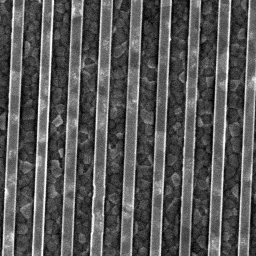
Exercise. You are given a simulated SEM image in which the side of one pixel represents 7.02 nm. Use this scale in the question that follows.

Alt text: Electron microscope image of parallel lines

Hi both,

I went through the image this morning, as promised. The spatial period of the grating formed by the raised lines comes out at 206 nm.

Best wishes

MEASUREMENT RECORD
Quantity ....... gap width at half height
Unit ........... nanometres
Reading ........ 130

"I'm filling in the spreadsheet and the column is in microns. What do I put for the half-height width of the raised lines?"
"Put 0.0745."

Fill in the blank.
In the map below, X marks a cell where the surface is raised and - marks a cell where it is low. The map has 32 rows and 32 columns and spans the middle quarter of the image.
-XXX-----XX-----XXX-----XX-----X
-XXX-----XX-----XXX-----XX-----X
-XXX-----XX-----XXX-----XX-----X
-XXX-----XX-----XXX----XXX-----X
-XXX----XXX-----XXX----XXX-----X
-XXX----XXX-----XXX----XXX-----X
-XXX----XXX-----XXX----XXX-----X
-XXX----XXX-----XX-----XXX-----X
-XXX----XXX-----XX-----XXX-----X
-XXX----XXX-----XX-----XXX-----X
-XXX----XXX-----XX-----XXX-----X
-XXX----XXX-----XX-----XXX-----X
-XXX----XXX-----XX-----XXX-----X
-XX-----XXX-----XX-----XX------X
-XX-----XXX-----XX-----XX------X
-XX-----XXX----XXX-----XX-----XX
-XX-----XXX----XXX-----XX-----XX
-XX-----XXX----XXX-----XX-----XX
-XX-----XXX----XXX-----XX-----XX
-XX-----XX-----XXX-----XX-----XX
-XX-----XX-----XXX-----XX-----XX
XXX-----XX-----XXX-----XX-----XX
XXX-----XX-----XXX-----XX-----XX
XXX-----XX-----XXX-----XX-----XX
XXX-----XX-----XXX-----XX-----XX
XXX-----XX-----XXX-----XX-----XX
XXX-----XX-----XXX-----XX-----XX
XXX----XXX-----XXX----XXX-----XX
XXX----XXX-----XXX----XXX-----XX
XXX----XXX-----XXX----XXX-----XX
XXX----XXX-----XX-----XXX-----XX
XXX-----XX-----XX-----XXX-----XX